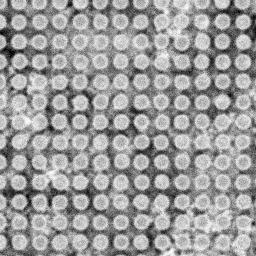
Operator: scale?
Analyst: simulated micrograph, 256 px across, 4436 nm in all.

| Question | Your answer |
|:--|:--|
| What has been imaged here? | a regular array of raised bodies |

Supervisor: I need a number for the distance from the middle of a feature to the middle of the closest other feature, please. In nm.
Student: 340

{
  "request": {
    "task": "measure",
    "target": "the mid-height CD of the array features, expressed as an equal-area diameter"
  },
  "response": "247 nm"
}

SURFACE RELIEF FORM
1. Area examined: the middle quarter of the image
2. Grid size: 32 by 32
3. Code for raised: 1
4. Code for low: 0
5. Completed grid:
00011100110001110011100111001110
00000000000000000000000000000000
00000000000000000000000000000000
00011000111001110011100111001110
10111100111001110011100111001110
10011000111001110011100111001110
00000000000000000000000000000000
00000000000000000000000000000000
00011000111001110011100111001110
10111100111001110011100111001110
10011100110001110011100111001110
00000000000000000000000000000000
00000000000000000000000000000000
00011000110001110011100111001110
10111101111001110011100111001110
00011000110001110011100111001110
00000000000000000000000000000000
00000000000000000000000000000000
10111100111001110011100111001110
10111100111001110011100111001110
10011000111001110011100111001110
00000000000000000000000000000000
00000000000000000000000000000000
10011100111001110011100111001110
10011100111001110011100111001110
10011100111001110011100111001110
00000000000000000000000000000000
00000000000000000000000000000000
10011000111001110011100111001110
10111100111001110011100111001110
10011000111001110011100111001110
00000000000000000000000000000000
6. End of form